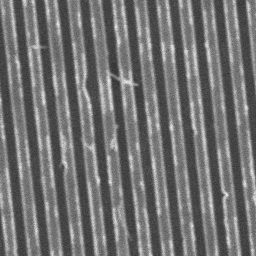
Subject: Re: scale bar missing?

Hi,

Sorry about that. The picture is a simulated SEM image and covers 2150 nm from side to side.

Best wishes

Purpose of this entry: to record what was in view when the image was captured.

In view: parallel lines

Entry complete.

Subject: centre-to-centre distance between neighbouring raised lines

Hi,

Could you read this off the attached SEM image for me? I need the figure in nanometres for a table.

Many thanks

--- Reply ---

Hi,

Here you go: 186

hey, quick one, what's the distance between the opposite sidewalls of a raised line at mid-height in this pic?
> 98 nm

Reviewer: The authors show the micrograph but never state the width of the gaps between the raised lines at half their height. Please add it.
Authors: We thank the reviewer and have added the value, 10.8 px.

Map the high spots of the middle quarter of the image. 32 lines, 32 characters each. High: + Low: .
...++...+++...+++..+++...+++...+
...+++..+++...+++...++...+++...+
...++....+++..+++...++...+++...+
...++....++..++++...+++..+++...+
...++....+++..+++...+++...++...+
...++....+++..+++...+++...++...+
...+++...+++..+++...+++...++...+
+..+++...+++...++...+++...++...+
+...++...+++...++...+++...+++..+
+...++...+++...+++..+++...+++...
+...+++..+++...+++...++...+++...
+...+++...++...+++...++...+++...
+...+++...++...+++...+++..+++...
+...+++...+++..+++...+++...++...
+...+++...+++..+++...+++...++...
+....++...+++..+++...+++...++...
++...++...+++...++...+++...++...
++...++...+++...++...+++...+++..
++...++...+++...+++..+++...+++..
++...+++..+++...+++...++...+++..
++...+++...++...+++...++...+++..
++...+++...++...+++...+++..+++..
++...+++...+++..+++...+++...++..
++...+++...+++..+++...+++...++..
++...+++...+++...++...+++...++..
+++..+++...+++...++...+++...+++.
+++...++...+++...++...+++...+++.
+++...++...+++...+++..+++...+++.
+++...+++..+++...+++..+++...+++.
+++...+++..+++...+++...++...+++.
.++...+++...++...+++...+++..+++.
.++...+++...+++..+++...+++..+++.